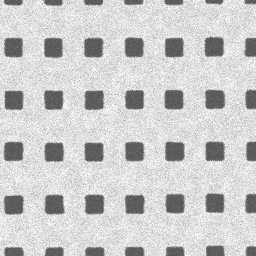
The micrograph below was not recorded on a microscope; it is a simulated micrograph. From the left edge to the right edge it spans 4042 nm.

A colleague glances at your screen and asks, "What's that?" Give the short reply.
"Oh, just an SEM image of a regular array of holes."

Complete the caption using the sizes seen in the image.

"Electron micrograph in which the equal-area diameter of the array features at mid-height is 21.3 px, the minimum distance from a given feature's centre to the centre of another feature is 40 pixels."